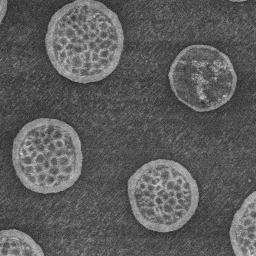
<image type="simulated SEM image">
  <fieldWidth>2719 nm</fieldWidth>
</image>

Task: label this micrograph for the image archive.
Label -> raised bodies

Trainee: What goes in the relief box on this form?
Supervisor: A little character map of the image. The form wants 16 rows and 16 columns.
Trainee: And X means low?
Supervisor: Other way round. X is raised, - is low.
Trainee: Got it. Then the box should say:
----XX----------
---XXXX---------
---XXXXX--------
---XXXX---------
----XXX---------
----------------
----------------
----------------
-XXXX-----------
-XXXX-----------
-XXXX----XX-----
--XX----XXXX----
--------XXXX----
---------XXX---X
---------------X
XX-------------X